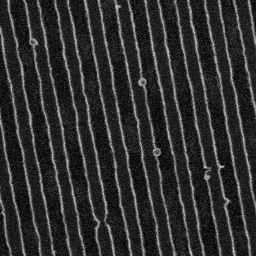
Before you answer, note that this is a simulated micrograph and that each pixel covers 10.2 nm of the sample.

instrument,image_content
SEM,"parallel lines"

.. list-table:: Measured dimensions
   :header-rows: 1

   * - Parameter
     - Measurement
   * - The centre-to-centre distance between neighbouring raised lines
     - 300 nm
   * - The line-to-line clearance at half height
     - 158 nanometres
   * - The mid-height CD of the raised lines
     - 0.14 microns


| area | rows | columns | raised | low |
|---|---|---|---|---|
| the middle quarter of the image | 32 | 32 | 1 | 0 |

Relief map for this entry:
01110000111100001110000111100001
01110000111100001110000111100001
01110000111100001110000011100001
01111000011100001111000011100001
01111000011100000111000011100001
00111000011100000111000011110000
00111000011100000111000011110000
00111000011110000111000011110000
00111000011110000111100001110000
00111100001110000111100001110000
00111100001110000011100001110000
00011100001110000011100001111000
00011100001111000011100001111000
00011100001111000011100001111000
00011100000111000011110000111000
00011100000111000011110000111000
00011110000111000001110000111100
00001110000111000001110000111100
00001110000011100001110000111100
00001110000011100001110000011100
00001111000011100001111000011100
00001111000011100000111100011100
10000111000011110001111100011100
10000111000011110000111000001110
10000111000001110000111100001110
10000111000001110000111100001110
10000011100001110000111100001110
10000111100001111000111100001111
10000011100001111000011100001111
11000011100001111000011100000111
11000011110000111000011100000111
11000011110000111000011100000111